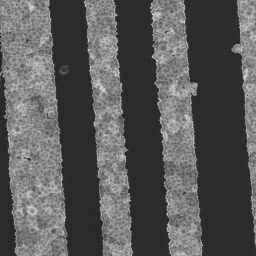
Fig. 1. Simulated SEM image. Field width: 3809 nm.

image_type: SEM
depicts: one or a few lines or trenches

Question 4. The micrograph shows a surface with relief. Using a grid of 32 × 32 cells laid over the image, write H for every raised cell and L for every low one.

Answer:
HHHHHHLLLLLHHHLLLLLHHHHLLLLLLLHH
HHHHHHLLLLLHHHLLLLLHHHHLLLLLLLHH
HHHHHHLLLLLHHHLLLLLHHHHLLLLLLLHH
HHHHHHLLLLLHHHHLLLLHHHHLLLLLLLHH
HHHHHHLLLLLHHHHLLLLHHHHLLLLLLLHH
HHHHHHHLLLLHHHHLLLLHHHHLLLLLLLHH
HHHHHHLLLLLHHHHLLLLHHHHLLLLLLHHH
HHHHHHLLLLLHHHHLLLLHHHHLLLLLLLHH
HHHHHHHLLLLHHHHLLLLLHHHHLLLLLLHH
LHHHHHHLLLLHHHHLLLLLHHHLLLLLLLLH
LHHHHHHLLLLLHHHLLLLLHHHHLLLLLLLH
LHHHHHHLLLLLHHHLLLLLHHHHHLLLLLLH
LHHHHHHLLLLLHHHLLLLLHHHHLLLLLLLH
LHHHHHHLLLLLHHHLLLLLHHHHLLLLLLLH
LHHHHHHLLLLLHHHLLLLLHHHHLLLLLLLH
LHHHHHHLLLLLHHHLLLLLHHHHLLLLLLLH
LHHHHHHLLLLLHHHLLLLLHHHHLLLLLLLH
LHHHHHHLLLLLHHHHLLLLHHHHLLLLLLLH
LHHHHHHHLLLLHHHHLLLLHHHHLLLLLLLH
LHHHHHHHLLLLHHHHLLLLHHHHLLLLLLLH
LHHHHHHHLLLLHHHHLLLLLHHHLLLLLLLH
LHHHHHHHLLLLHHHHLLLLLHHHHLLLLLLH
LHHHHHHHLLLLLHHHLLLLLHHHHLLLLLLH
LHHHHHHHLLLLHHHHLLLLLHHHHLLLLLLH
LLHHHHHHLLLLLHHHLLLLLHHHHLLLLLLL
LLHHHHHHLLLLLHHHLLLLLHHHHLLLLLLL
LLHHHHHHLLLLLHHHLLLLLHHHHLLLLLLL
LLHHHHHHLLLLLHHHLLLLLHHHHLLLLLLL
LLHHHHHHLLLLLHHHLLLLLHHHHLLLLLLL
LLHHHHHHLLLLLHHHLLLLLHHHHLLLLLLL
LLHHHHHHLLLLLHHHLLLLLHHHHLLLLLLL
LLHHHHHHLLLLLHHHLLLLLHHHHLLLLLLL